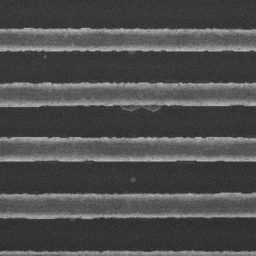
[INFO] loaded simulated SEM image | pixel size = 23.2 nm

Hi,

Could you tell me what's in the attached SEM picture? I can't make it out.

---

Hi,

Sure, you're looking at lines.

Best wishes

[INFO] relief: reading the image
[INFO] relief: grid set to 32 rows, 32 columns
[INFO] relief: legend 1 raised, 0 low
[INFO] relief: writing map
00000000000000000000000000000000
00000000000000000000000000000000
00000000000000000000000000000000
00000000000000000000000000000000
11111111111111111111111111111111
11111111111111111111111111111111
00000000000000000000000000000000
00000000000000000000000000000000
00000000000000000000000000000000
00000000000000000000000000000000
00000000000000000000000000001100
11111111111111111111111111111111
11111111111111111111111111111111
00000000000000000000000000000000
00000000000000000000000000000000
00000000000000000000000000000000
00000000000000000000000000000000
11111111111111111111111111111111
11111111111111111111111111111111
11111111111111111111111111111111
00000000000000000000000000000000
00000000000000000000000000000000
00000000000000000000000000000000
00000000000000000000000000000000
11111111111111111111111111111111
11111111111111111111111111111111
11111111111111111111111111111111
00000000000000000000000000000000
00000000000000000000000000000000
00000000000000000000000000000000
00000000000000000000000000000000
00000000000000000000000000000000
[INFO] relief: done